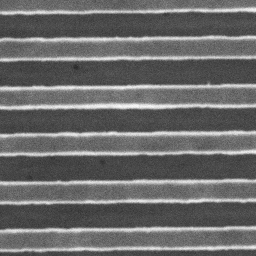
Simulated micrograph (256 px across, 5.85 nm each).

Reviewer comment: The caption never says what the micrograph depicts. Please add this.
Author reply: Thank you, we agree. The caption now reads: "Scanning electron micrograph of lines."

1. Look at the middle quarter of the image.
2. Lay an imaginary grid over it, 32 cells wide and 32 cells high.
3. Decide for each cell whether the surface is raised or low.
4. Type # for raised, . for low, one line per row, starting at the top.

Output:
................................
................................
................................
................................
................................
..............................##
################################
################################
################################
################################
################################
................................
................................
................................
................................
................................
................................
......##########################
################################
################################
################################
################################
................................
................................
................................
................................
................................
................................
................................
.....##.#..#####################
################################
################################